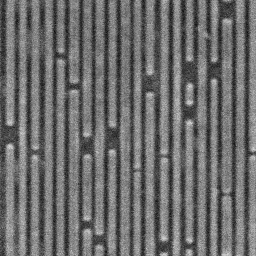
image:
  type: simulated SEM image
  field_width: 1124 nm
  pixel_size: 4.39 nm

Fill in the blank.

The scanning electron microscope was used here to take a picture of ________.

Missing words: parallel lines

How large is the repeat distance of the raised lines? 56 nm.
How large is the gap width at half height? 26.9 nm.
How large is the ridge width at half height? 30.2 nanometers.